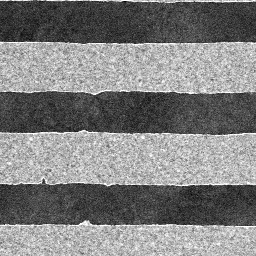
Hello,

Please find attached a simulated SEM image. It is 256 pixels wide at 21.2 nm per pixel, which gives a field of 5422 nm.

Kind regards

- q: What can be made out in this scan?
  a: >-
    one or a few lines or trenches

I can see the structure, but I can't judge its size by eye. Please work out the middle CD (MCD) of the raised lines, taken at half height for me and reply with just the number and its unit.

1060 nm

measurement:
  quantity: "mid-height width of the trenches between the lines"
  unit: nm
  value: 882